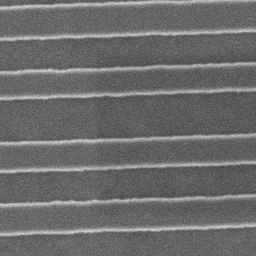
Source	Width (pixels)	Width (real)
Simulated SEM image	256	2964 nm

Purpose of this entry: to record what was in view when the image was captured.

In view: lines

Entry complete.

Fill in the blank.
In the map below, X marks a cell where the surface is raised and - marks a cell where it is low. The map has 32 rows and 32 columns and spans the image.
---------XXXXXXXXXXXXXXXXXXXXXXX
XXXXXXXXXXXXXXXXXXXXXXXXXXXXXXXX
XXXXXXXXXXXXXXXXXXXXXXXXXXXXXXXX
XXXXXXXXXXXXXXXXXXXXXXXXXXXXXXXX
XXXXXXXXXXXXXX------------------
--------------------------------
--------------------------------
--------------------------------
--------------XXXXXXXXXXXXXXXXXX
XXXXXXXXXXXXXXXXXXXXXXXXXXXXXXXX
XXXXXXXXXXXXXXXXXXXXXXXXXXXXXXXX
XXXXXXXXXXXXXXXXXXXXXXXXXXX-----
--------------------------------
--------------------------------
--------------------------------
--------------------------------
--------------------------------
------------XXXXXXXXXXXXXXXXXXXX
XXXXXXXXXXXXXXXXXXXXXXXXXXXXXXXX
XXXXXXXXXXXXXXXXXXXXXXXXXXXXXXXX
XXXXXXXXXXXXXXXXXXXXXXXXXXXXXX--
XX------------------------------
--------------------------------
--------------------------------
----------------------------XXXX
---XXXXXXXXXXXXXXXXXXXXXXXXXXXXX
XXXXXXXXXXXXXXXXXXXXXXXXXXXXXXXX
XXXXXXXXXXXXXXXXXXXXXXXXXXXXXXXX
XXXXXXXXXXXXXXXXXXXXXXXXXX------
--------------------------------
--------------------------------
--------------------------------